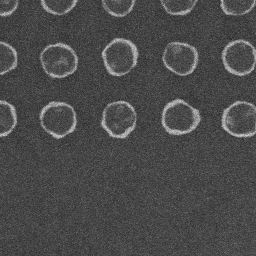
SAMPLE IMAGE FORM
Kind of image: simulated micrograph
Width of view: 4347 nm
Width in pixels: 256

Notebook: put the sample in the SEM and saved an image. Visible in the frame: raised bodies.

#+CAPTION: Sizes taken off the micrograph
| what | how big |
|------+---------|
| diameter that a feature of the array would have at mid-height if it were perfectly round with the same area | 572 nanometres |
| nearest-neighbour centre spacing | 59.4 px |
